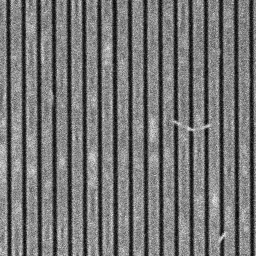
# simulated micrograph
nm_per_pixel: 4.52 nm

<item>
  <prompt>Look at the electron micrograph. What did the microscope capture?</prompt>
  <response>parallel lines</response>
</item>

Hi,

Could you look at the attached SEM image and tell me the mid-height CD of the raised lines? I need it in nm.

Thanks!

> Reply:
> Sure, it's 45.2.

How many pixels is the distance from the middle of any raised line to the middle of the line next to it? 15.2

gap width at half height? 22.6 nm